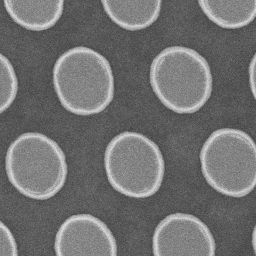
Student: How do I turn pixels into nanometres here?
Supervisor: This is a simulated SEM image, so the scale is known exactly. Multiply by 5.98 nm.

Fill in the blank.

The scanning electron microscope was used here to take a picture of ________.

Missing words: raised bodies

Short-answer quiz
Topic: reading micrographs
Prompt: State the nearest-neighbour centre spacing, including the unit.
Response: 584 nanometres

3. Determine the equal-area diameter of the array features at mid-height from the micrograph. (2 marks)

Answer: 60.1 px